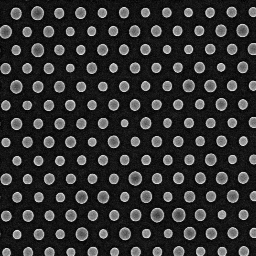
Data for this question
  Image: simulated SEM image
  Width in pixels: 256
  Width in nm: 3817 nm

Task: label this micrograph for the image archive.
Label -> a regular array of raised bodies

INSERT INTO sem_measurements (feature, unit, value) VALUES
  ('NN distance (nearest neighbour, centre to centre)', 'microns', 0.314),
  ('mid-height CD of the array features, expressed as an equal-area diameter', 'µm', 0.149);